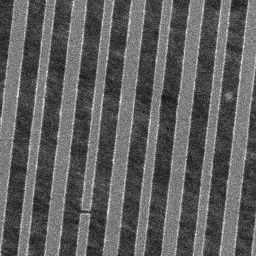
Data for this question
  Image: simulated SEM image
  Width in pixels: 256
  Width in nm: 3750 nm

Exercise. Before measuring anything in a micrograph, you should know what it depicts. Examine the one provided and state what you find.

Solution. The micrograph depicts parallel lines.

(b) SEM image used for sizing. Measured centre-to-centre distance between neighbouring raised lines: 421 nanometers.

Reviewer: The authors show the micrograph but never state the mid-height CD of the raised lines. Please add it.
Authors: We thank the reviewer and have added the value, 271 nm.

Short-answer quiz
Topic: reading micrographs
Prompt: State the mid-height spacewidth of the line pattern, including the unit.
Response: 12.4 px